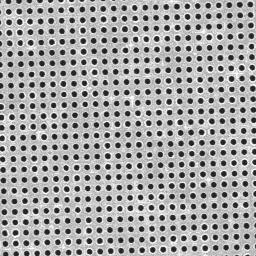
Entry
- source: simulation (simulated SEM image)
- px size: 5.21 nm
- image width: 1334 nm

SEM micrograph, a regular array of holes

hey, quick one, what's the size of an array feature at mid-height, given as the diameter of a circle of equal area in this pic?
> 29.4 nm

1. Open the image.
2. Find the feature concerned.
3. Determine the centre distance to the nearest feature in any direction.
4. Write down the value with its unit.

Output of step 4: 53.6 nanometres